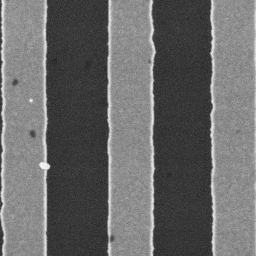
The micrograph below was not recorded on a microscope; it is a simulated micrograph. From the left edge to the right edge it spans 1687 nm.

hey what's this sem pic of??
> lines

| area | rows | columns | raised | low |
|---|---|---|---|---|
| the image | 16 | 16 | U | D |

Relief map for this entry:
UUUDDDDUUDDDDUUU
UUUDDDDUUUDDDUUU
UUUDDDDUUUDDDUUU
UUUDDDDUUUDDDUUU
UUUDDDDUUUDDDUUU
UUUDDDDUUUDDDUUU
UUUDDDDUUUDDDUUU
UUUDDDDUUUDDDUUU
UUUDDDDUUUDDDUUU
UUUDDDDUUUDDDUUU
UUUDDDDUUUDDDUUU
UUUDDDDUUUDDDUUU
UUUDDDDUUUDDDUUU
UUUDDDDUUUDDDUUU
UUUDDDDUUUDDDUUU
UUUDDDDUUUDDDUUU